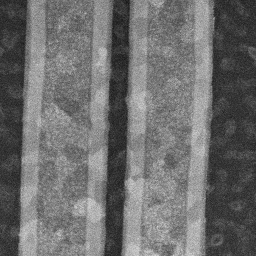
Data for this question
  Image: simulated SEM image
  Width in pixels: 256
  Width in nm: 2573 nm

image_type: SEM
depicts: one or a few lines or trenches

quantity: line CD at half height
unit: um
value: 0.646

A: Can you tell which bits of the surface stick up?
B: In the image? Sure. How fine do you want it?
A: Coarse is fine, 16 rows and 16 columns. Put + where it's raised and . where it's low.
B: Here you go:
..++++...++++...
..++++...++++...
..++++...++++...
..++++...++++...
..++++...++++...
..++++...++++...
..++++...++++...
..++++...++++...
..++++...+++....
..++++...+++....
..++++...+++....
..++++...+++....
..++++..++++....
..++++..++++....
..++++..++++....
..++++..++++....